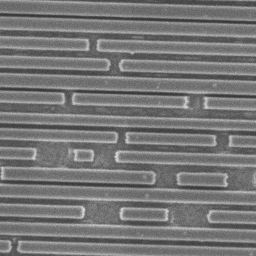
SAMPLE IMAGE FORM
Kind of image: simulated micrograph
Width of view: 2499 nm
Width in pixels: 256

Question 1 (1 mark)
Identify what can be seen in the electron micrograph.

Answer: parallel lines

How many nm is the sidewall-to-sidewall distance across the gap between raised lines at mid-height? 62.2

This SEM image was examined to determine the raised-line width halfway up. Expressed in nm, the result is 117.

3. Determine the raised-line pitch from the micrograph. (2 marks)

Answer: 0.181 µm